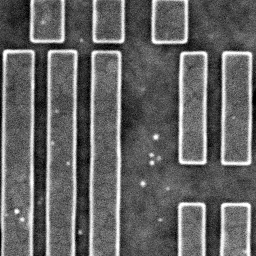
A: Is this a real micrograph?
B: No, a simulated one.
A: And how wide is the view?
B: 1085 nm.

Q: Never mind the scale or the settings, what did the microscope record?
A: wiring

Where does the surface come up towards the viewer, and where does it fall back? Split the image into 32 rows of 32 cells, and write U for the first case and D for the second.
DDDDUUUUDDDDUUUDDDDUUUUDDDDDDDDD
DDDDUUUUDDDDUUUDDDDUUUUDDDDDDDDD
DDDDUUUUDDDDUUUDDDDUUUUDDDDDDDDD
DDDDUUUUDDDDUUUDDDDUUUUDDDDDDDDD
DDDDUUUUDDDDUUUDDDDUUUUDDDDDDDDD
DDDDDDDDDDDDDDDDDDDDDDDDDDDDDDDD
DUUUDDUUUDDDUUUDDDDDDDDDDDDDDDDD
UUUUDDUUUUDDUUUDDDDDDDDUUUDDUUUD
UUUUDDUUUUDDUUUDDDDDDDDUUUDDUUUD
UUUUDDUUUUDDUUUDDDDDDDUUUUDDUUUD
UUUUDDUUUDDDUUUDDDDDDDUUUUDDUUUD
UUUUDDUUUDDUUUUDDDDDDDUUUUDDUUUD
UUUUDDUUUDDUUUUDDDDDDDUUUUDDUUUD
UUUUDDUUUDDUUUUDDDDDDDUUUUDDUUUD
UUUUDDUUUDDUUUUDDDDDDDUUUUDDUUUD
UUUUDDUUUDDUUUUDDDDDDDUUUUDDUUUD
UUUUDDUUUDDUUUUDDDDDDDUUUUDDUUUD
UUUUDDUUUDDUUUUDDDDDDDUUUUDDUUUD
UUUUDDUUUDDUUUUDDDDDDDUUUUDDUUUD
UUUUDDUUUDDUUUUDDDDDDDUUUUDDUUUD
UUUUDDUUUDDUUUUDDDDDDDDDDDDDUUUD
UUUUDDUUUDDUUUUDDDDDDDDDDDDDDDDD
UUUUDDUUUDDUUUUDDDDDDDDDDDDDDDDD
UUUUDDUUUDDUUUUDDDDDDDDDDDDDDDDD
UUUUDDUUUDDUUUUDDDDDDDDDDDDDDDDD
UUUUDDUUUDDUUUUDDDDDDDDUUDDDDDDD
UUUUDDUUUDDUUUUDDDDDDDUUUUDDUUUD
UUUUDDUUUDDUUUUDDDDDDDUUUUDDUUUD
UUUUDDUUUDDUUUUDDDDDDDUUUUDDUUUD
UUUUDDUUUDDUUUUDDDDDDDUUUUDDUUUD
UUUUDDUUUDDUUUUDDDDDDDUUUUDDUUUD
UUUUDDUUUDDUUUUDDDDDDDUUUUDDUUUD